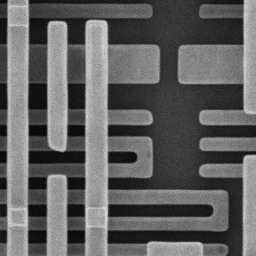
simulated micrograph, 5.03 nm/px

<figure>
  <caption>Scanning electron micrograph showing wiring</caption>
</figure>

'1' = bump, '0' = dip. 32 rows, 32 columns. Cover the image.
01100000000000000000000000000001
01110000000000000000000000000001
01110000000000000000000000000011
01110011000110000000000000000011
01110011000110000000000000000011
01110011000110000000000000000001
01110011000110000000000000000001
01100011000110000000000000000001
01100011000110000000000000000001
01100011000110000000000000000001
01100011000110000000000000000001
01100011000110000000000000000011
01100011000110000000000000000011
01100011000110000000000000000011
01100011000110000000000000000000
01100011000110000000000000000000
01100011000110000000000000000000
01100011000110000000000000000000
01100001000110000000000000000000
01100000000110000000000000000001
01100000000110000000000000000011
01100000000110000000000000000011
01100011000110000000000000000011
01100011000110000000000000000011
01100011000110000000000000000011
01100011000110000000000000000011
01100011000110000000000000000011
01100011000110000000000000000011
01100011000110000000000000000011
01100011000110000000000000000011
01100011000110000001111110000011
01100011000110000001111110000011